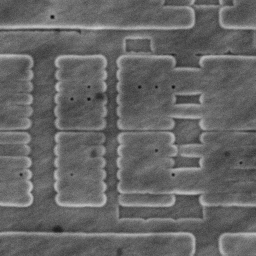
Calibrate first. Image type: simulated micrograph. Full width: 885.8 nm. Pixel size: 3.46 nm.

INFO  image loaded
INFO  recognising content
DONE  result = wiring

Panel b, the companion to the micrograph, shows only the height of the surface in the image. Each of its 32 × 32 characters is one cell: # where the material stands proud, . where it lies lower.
#####################........###
########################...#####
########################...#####
..........##############....####
................................
................................
................................
####...######..#######...#######
####...######..#######...#######
####...######..#################
####...######..#################
####...######..#################
####...######..#######...#######
####...######..#################
####...######..#################
####...######..#######...#######
###....######..######....#######
####...######..#######...#######
###....######..#################
####...######..#######.#########
####...######..#######...#######
####...######..#################
####...######..#################
####...######..#################
####...######............#######
####...######.............######
................................
................................
................................
########################....####
########################...#####
########################....####